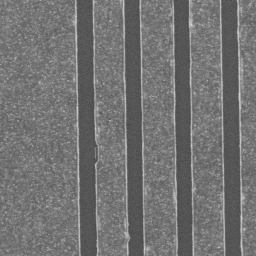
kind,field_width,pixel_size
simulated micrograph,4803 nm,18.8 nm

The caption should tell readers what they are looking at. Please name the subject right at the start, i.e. parallel lines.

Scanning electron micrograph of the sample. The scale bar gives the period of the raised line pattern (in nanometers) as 904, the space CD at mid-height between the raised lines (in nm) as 312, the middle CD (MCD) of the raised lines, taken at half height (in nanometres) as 593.